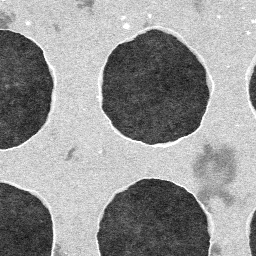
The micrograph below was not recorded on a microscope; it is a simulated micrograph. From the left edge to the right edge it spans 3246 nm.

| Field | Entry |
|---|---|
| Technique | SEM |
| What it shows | holes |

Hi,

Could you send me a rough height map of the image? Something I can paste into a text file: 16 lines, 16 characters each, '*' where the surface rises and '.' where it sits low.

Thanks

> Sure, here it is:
****************
****************
..******...*****
...****.....****
...***.......***
...***.......***
...***.......***
...****......***
..******....****
****************
****************
.*******...*****
...****.....****
...***.......***
...***.......***
...***.......***